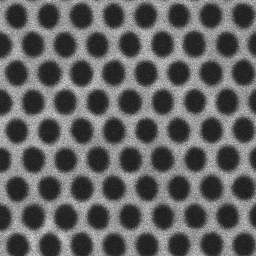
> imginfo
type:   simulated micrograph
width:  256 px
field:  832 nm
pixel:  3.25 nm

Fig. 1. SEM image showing a regular array of holes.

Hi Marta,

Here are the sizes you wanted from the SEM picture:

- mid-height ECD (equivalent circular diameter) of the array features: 77.3 nm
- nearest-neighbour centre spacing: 105 nm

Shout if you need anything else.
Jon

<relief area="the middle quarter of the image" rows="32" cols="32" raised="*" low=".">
**.....***.....***.....***.....*
**.....***.....***.....***.....*
*......**......***.....***......
**.....***.....***.....***.....*
**.....***.....***.....****....*
****.*******.*******.***********
.******...*****..*******..******
...***....****.....***.....****.
...***.....***.....***.....***..
...***.....***.....***......**..
...***.....***.....***.....***..
..****.....***.....****....****.
.*******..******..******..******
************.***************.***
**....*****...****.....***....**
**.....***.....***.....***.....*
**.....***......**......**......
**.....***.....***.....***.....*
**.....***.....***.....***.....*
***...*****...*****...******..**
********************************
..*****...*****....***....*****.
...***.....***.....***.....***..
...***.....***.....***.....***..
...***.....***......**.....***..
...***.....***.....***.....****.
..*****...*****...*****...******
********************************
***...*****...*****...*****...**
**.....***.....***.....***.....*
**.....***.....***.....***......
**.....***.....***.....***.....*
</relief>